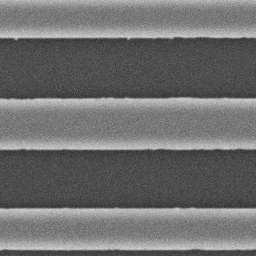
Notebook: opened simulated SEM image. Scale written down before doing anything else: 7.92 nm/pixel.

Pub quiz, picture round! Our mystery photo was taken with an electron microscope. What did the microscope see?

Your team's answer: lines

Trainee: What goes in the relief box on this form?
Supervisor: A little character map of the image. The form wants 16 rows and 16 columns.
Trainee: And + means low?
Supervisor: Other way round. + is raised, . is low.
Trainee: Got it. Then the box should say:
++++++++++++++++
++++++++++++++++
................
................
................
................
++++++++++++++++
++++++++++++++++
++++++++++++++++
................
................
................
................
++++++++++++++++
++++++++++++++++
++++++++++++++++